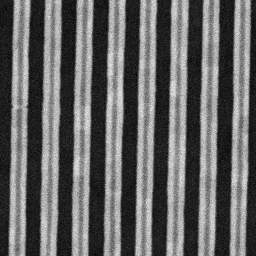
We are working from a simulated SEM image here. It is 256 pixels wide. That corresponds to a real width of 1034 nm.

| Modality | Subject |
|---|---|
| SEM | parallel lines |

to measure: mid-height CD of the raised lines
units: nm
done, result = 52.9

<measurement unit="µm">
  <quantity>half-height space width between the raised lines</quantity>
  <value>0.0746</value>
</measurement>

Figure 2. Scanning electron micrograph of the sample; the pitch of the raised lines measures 31.5 px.